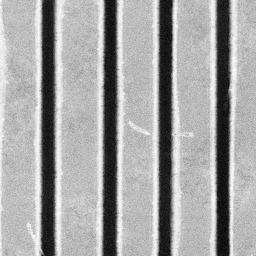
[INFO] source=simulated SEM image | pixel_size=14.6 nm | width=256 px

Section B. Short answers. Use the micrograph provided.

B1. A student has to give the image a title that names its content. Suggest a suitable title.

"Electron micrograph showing lines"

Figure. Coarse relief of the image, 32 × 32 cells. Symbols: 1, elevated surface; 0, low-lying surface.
11111001111110011111001111100111
11111001111110011111001111100111
11111001111110011111001111100111
11111001111110011111001111100111
11111001111110011111001111100111
11111001111110011111001111100111
11111001111110011111001111100111
11111001111110011111001111100111
11111001111110011111001111100111
11111001111110011111001111100111
11111001111110011111001111100111
11111001111110011111001111100111
11111001111110011111001111100111
11111001111110011111001111100111
11111001111110011111001111100111
11111001111110011111001111100111
11111001111110011111001111100111
11111001111110011111001111100111
11111001111110011111001111100111
11111001111110011111001111100111
11111001111110011111001111100111
11111001111110011111001111100111
11111001111110011111001111100111
11111001111110011111001111100111
11111001111110011111001111100111
11111001111110011111001111100111
11111001111110011111001111100111
11111001111110011111011111100111
11111001111110011111011111100111
11111001111110011111011111100111
11111001111110011111011111100111
11111001111110011111011111100111